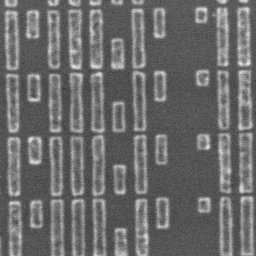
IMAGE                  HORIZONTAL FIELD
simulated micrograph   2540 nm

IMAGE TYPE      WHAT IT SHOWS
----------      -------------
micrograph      wiring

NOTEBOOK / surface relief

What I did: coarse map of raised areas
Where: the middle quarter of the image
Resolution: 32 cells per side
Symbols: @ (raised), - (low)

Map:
--@@---@@---@@@---@@------------
--------------------------------
--------@---------@@---@@-------
--@@---@@---------@@---@@-------
--@@---@@---------@@---@@-------
--@@---@@---------@@---@@-------
--@@---@@---------@@---@@-------
--@@---@@---------@@---@@-------
--@@---@@@--------@@---@@-------
--@@---@@@--------@@------------
--@@---@@@--@@@---@@------------
--@@---@@@--@@@---@@------------
--@@---@@@--@@@---@@------------
--@@---@@@--@@@---@@------------
--@@---@@@--@@@---@@------------
--@@---@@@--@@@---@@------------
--@@---@@@---@@-----------------
--------------------------------
--@@----@@--------@@---@@-------
--@@---@@@--------@@---@@-------
--@@---@@@--------@@---@@-------
--@@---@@@--------@@---@@-------
--@@---@@@--------@@---@@-------
--@@---@@@--------@@---@@-------
--@@---@@@--------@@---@@-------
--@@---@@@--------@@------------
--@@@--@@@---@@---@@------------
--@@@--@@@---@@---@@------------
--@@@--@@@---@@---@@------------
--@@@--@@@---@@---@@@-----------
--@@@--@@@---@@---@@@-----------
--@@@--@@@---@@---@@------------